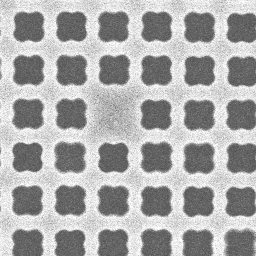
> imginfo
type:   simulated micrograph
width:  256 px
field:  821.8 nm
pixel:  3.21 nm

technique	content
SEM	a regular array of holes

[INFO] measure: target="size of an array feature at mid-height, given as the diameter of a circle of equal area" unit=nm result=103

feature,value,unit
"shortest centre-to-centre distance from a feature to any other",0.136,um